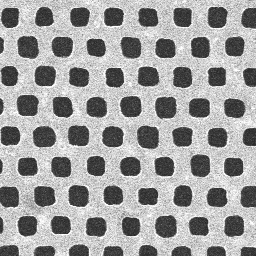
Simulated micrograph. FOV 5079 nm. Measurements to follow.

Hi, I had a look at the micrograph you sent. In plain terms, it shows a regular array of holes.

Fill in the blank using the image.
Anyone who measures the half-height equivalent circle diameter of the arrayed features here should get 413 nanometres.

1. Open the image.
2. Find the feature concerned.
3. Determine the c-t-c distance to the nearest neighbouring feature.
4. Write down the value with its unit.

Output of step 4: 667 nanometers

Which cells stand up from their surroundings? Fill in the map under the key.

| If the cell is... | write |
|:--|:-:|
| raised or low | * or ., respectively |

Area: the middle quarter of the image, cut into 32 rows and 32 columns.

********************************
**....*****...*****....****.....
*.....****.....***......***.....
*.....****.....***......***.....
*.....****.....***......***.....
**....*****...******..******....
********************************
********************************
.******..******....*****....****
..****....****.....****.....***.
..****.....***.....****.....***.
..****.....***......***.....***.
..****....*****....****.....***.
************************...*****
********************************
**...***************.***********
*.....****....****.....*****....
*.....****.....***......***.....
*.....***......***......***.....
*.....***......***......***.....
****.******...*****.....****...*
********************************
********************************
.*****....*****...*****...******
..****....****.....****....*****
..****....****.....****....*****
..****....****.....****....*****
..****....*****....****....*****
********************************
********************************
**...************************..*
*.....****....*****....****.....